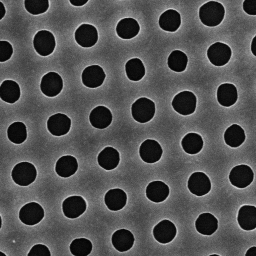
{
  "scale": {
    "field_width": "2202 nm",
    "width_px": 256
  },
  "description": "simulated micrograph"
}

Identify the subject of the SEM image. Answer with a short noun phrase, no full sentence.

a regular array of holes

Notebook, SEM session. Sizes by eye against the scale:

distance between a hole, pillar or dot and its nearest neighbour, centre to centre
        352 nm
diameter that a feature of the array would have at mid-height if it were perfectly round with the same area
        0.203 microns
